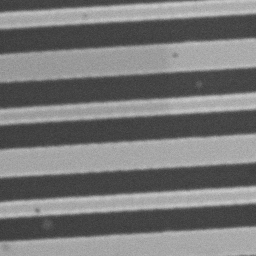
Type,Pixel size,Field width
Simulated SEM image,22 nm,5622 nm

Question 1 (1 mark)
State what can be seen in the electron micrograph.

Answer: lines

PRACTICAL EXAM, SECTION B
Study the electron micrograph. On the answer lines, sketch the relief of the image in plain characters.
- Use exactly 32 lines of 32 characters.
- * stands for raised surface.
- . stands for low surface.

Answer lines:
...................*************
..******************************
******************..............
**..............................
................................
.....................***********
.....***************************
********************************
******************************..
*************...................
................................
................................
..................**************
...*****************************
*****************...............
*...............................
................................
....................************
......**************************
********************************
****************************....
***********.....................
................................
.............................***
.............*******************
*****************************...
************....................
................................
...............................*
..............******************
********************************
********************************